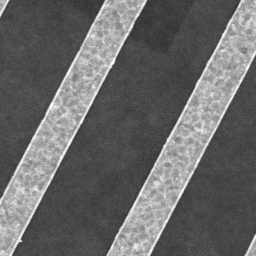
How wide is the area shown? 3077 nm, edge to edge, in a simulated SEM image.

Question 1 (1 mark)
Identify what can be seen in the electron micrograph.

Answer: one or a few lines or trenches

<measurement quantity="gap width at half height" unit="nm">1030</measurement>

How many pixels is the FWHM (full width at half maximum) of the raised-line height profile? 36.5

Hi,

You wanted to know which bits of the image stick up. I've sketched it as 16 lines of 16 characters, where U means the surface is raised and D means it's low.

DDDDDDUUUDDDDDDU
DDDDDDUUDDDDDDUU
DDDDDUUUDDDDDDUU
DDDDDUUDDDDDDUUU
DDDDUUUDDDDDDUUD
DDDDUUDDDDDDUUUD
DDDUUUDDDDDDUUDD
DDDUUDDDDDDUUUDD
DDUUUDDDDDDUUDDD
DDUUDDDDDDUUUDDD
DUUUDDDDDDUUDDDD
DUUDDDDDDUUUDDDD
UUDDDDDDDUUDDDDD
UUDDDDDDUUUDDDDD
UDDDDDDUUUDDDDDD
UDDDDDDUUUDDDDDD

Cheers